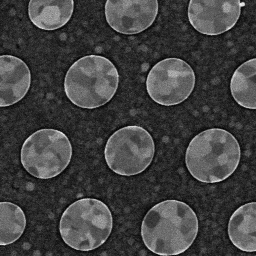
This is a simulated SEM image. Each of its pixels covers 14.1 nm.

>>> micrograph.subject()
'raised bodies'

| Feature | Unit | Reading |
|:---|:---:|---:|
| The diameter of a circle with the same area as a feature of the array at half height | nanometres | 720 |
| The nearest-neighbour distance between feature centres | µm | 1.13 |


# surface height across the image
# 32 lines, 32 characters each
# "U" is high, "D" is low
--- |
DDDDUUUUUDDDDUUUUUUUDDDDUUUUUUDD
DDDDUUUUUDDDDUUUUUUUDDDDUUUUUUDD
DDDDUUUUUDDDDUUUUUUDDDDDUUUUUUDD
DDDDDUUDDDDDDDUUUUDDDDDDUUUUUDDD
DDDDDDDDDDDDDDDDUDDDDDDDDDDDDDDD
DDDDDDDDDDDDDDDDDDDDDDDDDDDDDDDD
DDDDDDDDDDDDDDDDDDDDDDDDDDDDDDDD
UUUDDDDDDDUUUDDDDDDDUUUDDDDDDDDU
UUUDDDDDDUUUUUDDDDUUUUUUDDDDDDUU
UUUUDDDDUUUUUUUDDDUUUUUUDDDDDUUU
UUUUDDDDUUUUUUUDDDUUUUUUDDDDDUUU
UUUDDDDDUUUUUUDDDDDUUUUUDDDDDUUU
UUDDDDDDDUUUUUDDDDDUUUUDDDDDDUUU
DDDDDDDDDDDDDDDDDDDDDDDDDDDDDDDU
DDDDDDDDDDDDDDDDDDDDDDDDDDDDDDDD
DDDDDDDDDDDDDDDDDDDDDDDDDDDDDDDD
DDDDDUUDDDDDDDUUUUDDDDDDDUUUDDDD
DDDUUUUUDDDDDDUUUUUDDDDDUUUUUDDD
DDDUUUUUUDDDDUUUUUUDDDDUUUUUUUDD
DDDUUUUUUDDDDUUUUUUDDDDUUUUUUUDD
DDDUUUUUDDDDDUUUUUUDDDDUUUUUUUDD
DDDDUUUUDDDDDDUUUUDDDDDDUUUUUDDD
DDDDDDDDDDDDDDDDDDDDDDDDDUUUDDDD
DDDUDDDDDDDDDDDDDDDDDDDDDDDDDDDD
DDDDDDDDDDDDDDDDDDDDDDDDDDDDDDDD
UUDDDDDDDUUUUDDDDDDDUUUDDDDDDDDU
UUUDDDDDUUUUUUDDDDDUUUUUDDDDDUUU
UUUDDDDDUUUUUUDDDDUUUUUUUDDDDUUU
UUUDDDDDUUUUUUDDDDUUUUUUUDDDDUUU
UUDDDDDDUUUUUUDDDDUUUUUUDDDDDUUU
UDDDDDDDUUUUUDDDDDUUUUUUDDDDDUUU
DDDDDDDDDDDDDDDDDDDUUUUDDDDDDDDD